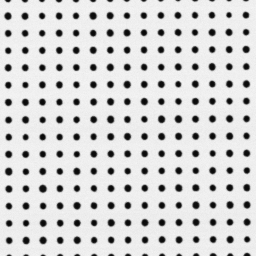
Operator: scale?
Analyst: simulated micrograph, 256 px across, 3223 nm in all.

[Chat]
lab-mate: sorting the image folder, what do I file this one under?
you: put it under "a regular array of holes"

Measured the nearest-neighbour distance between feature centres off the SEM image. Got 213 nm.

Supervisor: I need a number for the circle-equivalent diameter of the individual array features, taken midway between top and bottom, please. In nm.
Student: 87.5